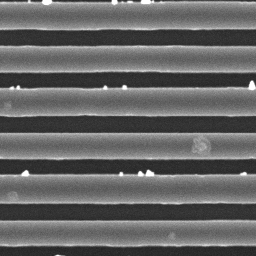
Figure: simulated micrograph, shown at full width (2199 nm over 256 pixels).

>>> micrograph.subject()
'lines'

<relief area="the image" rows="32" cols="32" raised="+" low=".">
++++++++++++++++++++++++++++++++
++++++++++++++++++++++++++++++++
++++++++++++++++++++++++++++++++
++++++++++++++++++++++++++++++++
................................
................................
++++++++++++++++++++++++++++++++
++++++++++++++++++++++++++++++++
++++++++++++++++++++++++++++++++
................................
...............................+
++++++++++++++++++++++++++++++++
++++++++++++++++++++++++++++++++
++++++++++++++++++++++++++++++++
.++.............................
................................
................................
++++++++++++++++++++++++++++++++
++++++++++++++++++++++++++++++++
++++++++++++++++++++++++++++++++
................................
..................+.............
++++++++++++++++++++++++++++++++
++++++++++++++++++++++++++++++++
++++++++++++++++++++++++++++++++
................................
................................
................................
++++++++++++++++++++++++++++++++
++++++++++++++++++++++++++++++++
++++++++++++++++++++++++++++++++
................................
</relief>